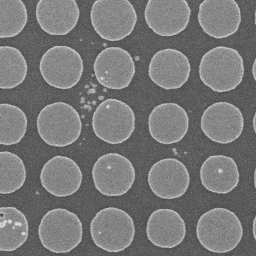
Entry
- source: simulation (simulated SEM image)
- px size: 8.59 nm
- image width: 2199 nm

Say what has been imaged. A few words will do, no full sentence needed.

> a regular array of raised bodies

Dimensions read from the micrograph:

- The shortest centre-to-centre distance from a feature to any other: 447 nanometers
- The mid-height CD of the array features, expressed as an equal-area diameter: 358 nm